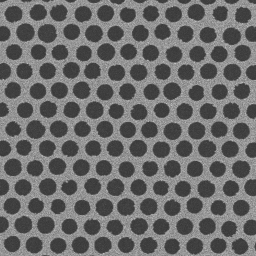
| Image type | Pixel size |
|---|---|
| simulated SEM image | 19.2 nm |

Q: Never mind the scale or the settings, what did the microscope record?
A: a regular array of holes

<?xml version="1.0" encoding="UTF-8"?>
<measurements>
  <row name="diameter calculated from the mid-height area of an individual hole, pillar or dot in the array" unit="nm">320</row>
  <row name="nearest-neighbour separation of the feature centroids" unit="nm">414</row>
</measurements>